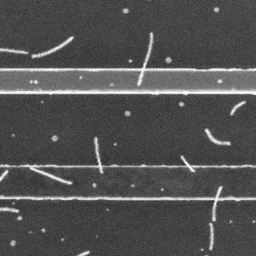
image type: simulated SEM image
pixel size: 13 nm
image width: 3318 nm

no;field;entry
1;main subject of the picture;lines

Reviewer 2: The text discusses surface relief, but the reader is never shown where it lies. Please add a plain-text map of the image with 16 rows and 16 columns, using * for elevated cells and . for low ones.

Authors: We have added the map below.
................
................
................
................
****************
****************
................
................
................
................
****************
****************
................
................
................
................